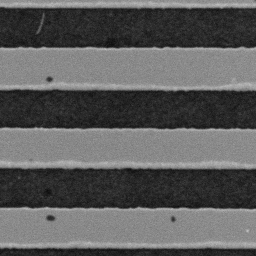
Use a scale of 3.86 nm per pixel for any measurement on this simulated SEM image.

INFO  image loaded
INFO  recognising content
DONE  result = lines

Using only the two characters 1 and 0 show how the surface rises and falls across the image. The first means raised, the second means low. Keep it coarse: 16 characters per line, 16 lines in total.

0000000000000000
0000000000000000
0000000000000000
1111111111111111
1111111111111111
1111111111111111
0000000000000000
0000000000000000
1111111111111111
1111111111111111
0000000000000001
0000000000000000
0000000000000000
1111111111111111
1111111111111111
0000000001000001